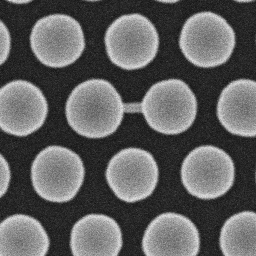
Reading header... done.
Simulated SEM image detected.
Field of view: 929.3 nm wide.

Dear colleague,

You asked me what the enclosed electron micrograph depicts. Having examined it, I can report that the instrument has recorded a regular array of raised bodies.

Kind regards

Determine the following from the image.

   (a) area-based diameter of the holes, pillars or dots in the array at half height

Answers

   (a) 194 nm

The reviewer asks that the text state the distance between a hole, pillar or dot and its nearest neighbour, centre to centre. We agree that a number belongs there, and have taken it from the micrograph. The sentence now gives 0.273 um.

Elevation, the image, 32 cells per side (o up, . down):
................................
................................
.....oooo......ooo......oooo....
o...oooooo....ooooo....oooooo...
o...oooooo...ooooooo...oooooo...
o...oooooo...ooooooo...oooooo...
o...oooooo...oooooo....oooooo...
o....oooo.....ooooo.....oooo....
...............oo...............
................................
.ooo......oooo......ooo......ooo
ooooo....oooooo....ooooo....oooo
oooooo...oooooo...oooooo...ooooo
oooooo..ooooooo...oooooo...ooooo
oooooo..ooooooo...oooooo...ooooo
ooooo....oooooo....ooooo....oooo
.ooo......oooo......ooo......ooo
................................
......oo.................oo.....
.....ooooo....ooooo.....oooo....
o...oooooo....ooooo....oooooo...
o...oooooo...ooooooo...oooooo...
o...oooooo...ooooooo...oooooo...
o...oooooo....ooooo....oooooo...
.....oooo......ooo.......oo.....
................................
................................
.ooo......oooo.....ooooo.....ooo
ooooo....oooooo....ooooo....oooo
oooooo...oooooo...ooooooo...oooo
oooooo...oooooo...ooooooo...oooo
oooooo...oooooo...ooooooo...oooo